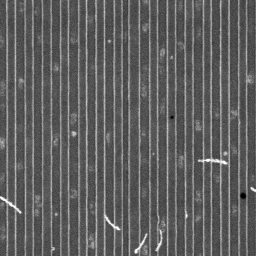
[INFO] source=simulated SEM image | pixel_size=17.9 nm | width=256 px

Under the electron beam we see parallel lines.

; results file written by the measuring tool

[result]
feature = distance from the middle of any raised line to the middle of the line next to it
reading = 319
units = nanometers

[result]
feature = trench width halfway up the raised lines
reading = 155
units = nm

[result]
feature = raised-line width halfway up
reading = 155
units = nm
